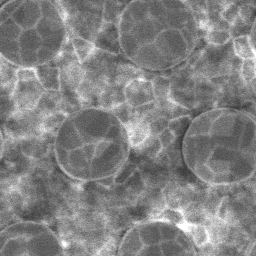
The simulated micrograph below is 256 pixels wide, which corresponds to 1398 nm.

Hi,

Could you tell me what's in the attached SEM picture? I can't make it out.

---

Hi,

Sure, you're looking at raised bodies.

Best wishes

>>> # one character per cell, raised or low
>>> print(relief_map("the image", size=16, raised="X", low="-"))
XXX-----XXXX----
XXXX---XXXXX----
XXXX---XXXXX----
XXX-----XXXX----
----------------
----------------
----------------
----XXX-----XXXX
----XXXX----XXXX
---XXXXX---XXXXX
----XXXX----XXXX
----------------
----------------
----------------
XXX-----XXX-----
XXXX---XXXXX----